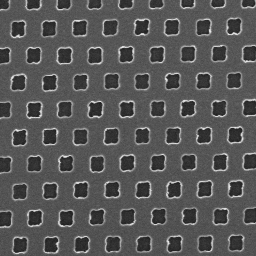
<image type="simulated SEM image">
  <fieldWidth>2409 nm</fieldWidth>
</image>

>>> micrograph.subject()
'a regular array of holes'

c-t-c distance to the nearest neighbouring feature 287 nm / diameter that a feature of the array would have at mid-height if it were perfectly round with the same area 143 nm